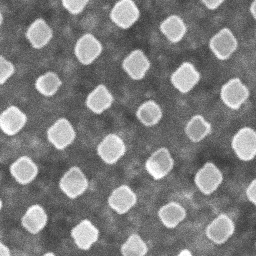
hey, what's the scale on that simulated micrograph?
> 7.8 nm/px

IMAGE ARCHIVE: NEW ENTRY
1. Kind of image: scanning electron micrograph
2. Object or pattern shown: a regular array of raised bodies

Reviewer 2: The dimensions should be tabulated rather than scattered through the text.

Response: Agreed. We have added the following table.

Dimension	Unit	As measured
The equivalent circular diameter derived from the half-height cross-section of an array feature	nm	190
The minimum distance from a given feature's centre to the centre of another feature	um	0.394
